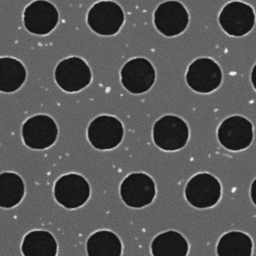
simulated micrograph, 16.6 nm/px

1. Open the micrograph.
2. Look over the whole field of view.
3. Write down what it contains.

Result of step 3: a regular array of holes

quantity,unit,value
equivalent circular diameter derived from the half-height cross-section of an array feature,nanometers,582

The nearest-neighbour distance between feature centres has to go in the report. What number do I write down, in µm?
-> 1.09